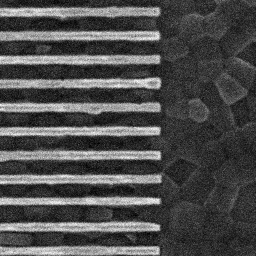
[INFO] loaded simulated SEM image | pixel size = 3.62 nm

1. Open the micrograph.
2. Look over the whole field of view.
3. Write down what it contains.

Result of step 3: parallel lines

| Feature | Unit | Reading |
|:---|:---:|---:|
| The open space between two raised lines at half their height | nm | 57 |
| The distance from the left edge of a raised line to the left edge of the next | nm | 86.3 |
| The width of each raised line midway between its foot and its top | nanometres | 28.9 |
